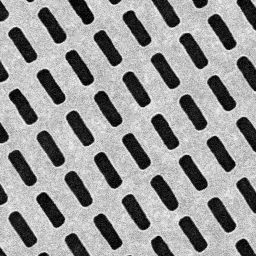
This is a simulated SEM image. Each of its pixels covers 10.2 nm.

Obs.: a regular array of holes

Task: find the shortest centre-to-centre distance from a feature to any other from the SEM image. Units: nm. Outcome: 350